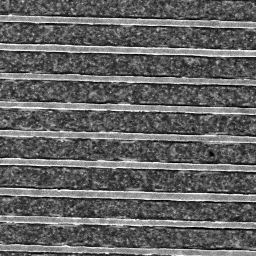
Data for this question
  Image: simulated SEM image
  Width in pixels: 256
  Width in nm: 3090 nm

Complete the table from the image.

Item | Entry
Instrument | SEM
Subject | parallel lines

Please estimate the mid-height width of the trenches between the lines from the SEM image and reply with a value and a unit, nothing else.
274 nm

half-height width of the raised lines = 5.75 pixels